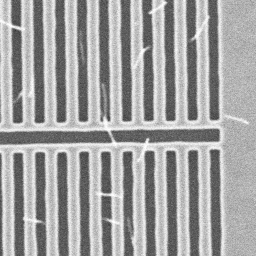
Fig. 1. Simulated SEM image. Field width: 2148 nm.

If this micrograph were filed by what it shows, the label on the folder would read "groups of lines, slits or small figures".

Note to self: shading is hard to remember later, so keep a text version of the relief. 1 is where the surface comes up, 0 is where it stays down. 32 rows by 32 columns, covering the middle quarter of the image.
01100011100111000111000110001100
01100011100011000111000110001100
01100011100011000111000110001110
01100011000011000111000110001110
01100011100011000111000110001110
01100011100011000111000110001110
01100011100011000111000110001110
01100011100011000111000110001100
01100011100011000111000110001100
01100011100011000111000110001110
01100011100011000111000110001110
01100011100011000111000110001110
01110011100011000111000110001110
01110011100011000111000110001110
01110011111111100111001111011111
11111111111111111111111111111111
11111111111100000000000000000000
00000000000000000000000000000000
00000000000000000000000000000000
00000000000010000000100000011000
11111111111111111111111111111111
11111111111111111111101111011110
01110011100011000111000110001110
01110011100011000111000110001110
01110011100011000111000110001110
01110011100011100111000110001110
01110011100011100111000110001110
01110011100011100111000110001110
01110011100011100011000111001110
01110011100011000011000111001110
01110011100011100111000111001110
01110011100011100111000111001110